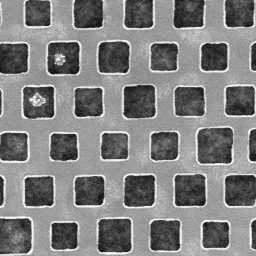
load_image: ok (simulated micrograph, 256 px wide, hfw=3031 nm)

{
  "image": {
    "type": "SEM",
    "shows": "a regular array of holes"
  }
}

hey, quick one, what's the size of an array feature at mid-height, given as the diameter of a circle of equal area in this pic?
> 408 nanometres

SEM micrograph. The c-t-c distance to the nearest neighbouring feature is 595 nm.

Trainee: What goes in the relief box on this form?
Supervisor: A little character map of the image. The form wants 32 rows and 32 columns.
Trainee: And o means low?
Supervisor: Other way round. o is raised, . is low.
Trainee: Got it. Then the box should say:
ooo...ooo....ooo...ooo....oo....
ooo...ooo....oo....ooo....oo....
ooo...ooo....oo....ooo....oo....
oooooooooo..oooo..oooo...ooooooo
oooooooooooooooooooooooooooooooo
...ooo....ooo...ooo...ooo...oooo
....oo....oo....ooo...ooo....oo.
....oo....oo....ooo...ooo....oo.
...ooo....oo....ooo...ooo...ooo.
oooooooooooooooooooooooooooooooo
oooooooooooooooooooooooooooooooo
ooo....oo....oo....ooo....oo....
ooo....oo....oo....ooo....oo....
ooo....oo....oo.....oo....oo....
ooo....ooo...ooo...ooo...oooo..o
oooooooooooooooooooooooooooooooo
ooooooo.ooooo..ooooo..ooo....oo.
....oo....oo....ooo...ooo....oo.
....oo....ooo...ooo...ooo....oo.
....oo....ooo...ooo...ooo....oo.
ooooooooooooooooooooooooo...oooo
oooooooooooooooooooooooooooooooo
ooo....oo....ooo...ooo....oo....
.oo....oo....oo.....oo....oo....
.oo....oo....oo....ooo....oo....
ooo....oo....ooo...ooo....oo....
oooooooooooooooooooooooooooooooo
....ooooooooo...ooo...oooooooooo
....oo....oo.....oo....oo....oo.
....oo....oo.....oo....oo....oo.
....oo....oo.....oo....oo....oo.
....ooooooooo...oooooooooooooooo